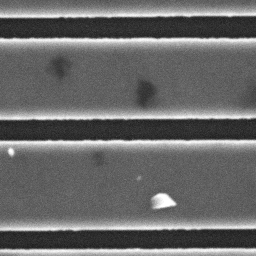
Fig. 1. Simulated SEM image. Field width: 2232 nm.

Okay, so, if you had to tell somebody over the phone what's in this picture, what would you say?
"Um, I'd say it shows lines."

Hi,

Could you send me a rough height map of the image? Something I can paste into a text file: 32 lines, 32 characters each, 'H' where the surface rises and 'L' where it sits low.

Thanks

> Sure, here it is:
HHHHHHHHHHHHHHHHHHHHHHHHHHHHHHHH
HHHHHHHHHHHHHHHHHHHHHHHHHHHHHHHH
LLLLLLLLLLLLLLLLLLLLLLLLLLLLLLLL
LLLLLLLLLLLLLLLLLLLLLLLLLLLLLLLL
LLLLLLLLLLLLLLLLLLLLLLLLLLLLLLLL
HHHHHHHHHHHHHHHHHHHHHHHHHHHHHHHH
HHHHHHHHHHHHHHHHHHHHHHHHHHHHHHHH
HHHHHHHHHHHHHHHHHHHHHHHHHHHHHHHH
HHHHHHHHHHHHHHHHHHHHHHHHHHHHHHHH
HHHHHHHHHHHHHHHHHHHHHHHHHHHHHHHH
HHHHHHHHHHHHHHHHHHHHHHHHHHHHHHHH
HHHHHHHHHHHHHHHHHHHHHHHHHHHHHHHH
HHHHHHHHHHHHHHHHHHHHHHHHHHHHHHHH
HHHHHHHHHHHHHHHHHHHHHHHHHHHHHHHH
HHHHHHHHHHHHHHHHHHHHHHHHHHHHHHHH
LLLLLLLLLLLLLLLLLLLLLLLLLLLLLLLL
LLLLLLLLLLLLLLLLLLLLLLLLLLLLLLLL
LLLLLLLLLLLLLLLLLLLLLLLLLLLLLLLL
HHHHHHHHHHHHHHHHHHHHHHHHHHHHHHHH
HHHHHHHHHHHHHHHHHHHHHHHHHHHHHHHH
HHHHHHHHHHHHHHHHHHHHHHHHHHHHHHHH
HHHHHHHHHHHHHHHHHHHHHHHHHHHHHHHH
HHHHHHHHHHHHHHHHHHHHHHHHHHHHHHHH
HHHHHHHHHHHHHHHHHHHHHHHHHHHHHHHH
HHHHHHHHHHHHHHHHHHHHHHHHHHHHHHHH
HHHHHHHHHHHHHHHHHHHHHHHHHHHHHHHH
HHHHHHHHHHHHHHHHHHHHHHHHHHHHHHHH
HHHHHHHHHHHHHHHHHHHHHHHHHHHHHHHH
HHHHHHHHHHHHHHHHHHHHHHHHHHHHHHHH
LLLLLLLLLLLLLLLLLLLLLLLLLLLLLLLL
LLLLLLLLLLLLLLLLLLLLLLLLLLLLLLLL
HHHHHHHHHHHHHHHHHHHHHHHHHHHHHHHH